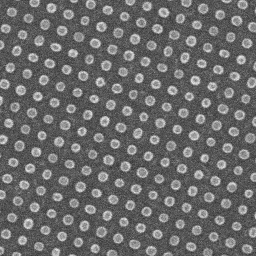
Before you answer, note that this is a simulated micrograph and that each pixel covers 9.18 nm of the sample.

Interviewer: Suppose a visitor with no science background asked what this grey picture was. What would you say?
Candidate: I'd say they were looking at a regular array of raised bodies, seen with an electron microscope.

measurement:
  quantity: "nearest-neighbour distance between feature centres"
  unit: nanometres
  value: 159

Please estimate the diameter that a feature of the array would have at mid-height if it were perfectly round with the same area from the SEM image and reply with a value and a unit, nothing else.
78.2 nm